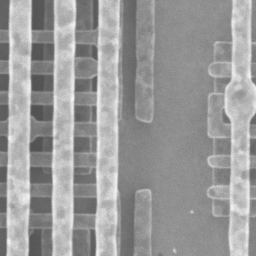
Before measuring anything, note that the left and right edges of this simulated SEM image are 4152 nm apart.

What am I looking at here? wiring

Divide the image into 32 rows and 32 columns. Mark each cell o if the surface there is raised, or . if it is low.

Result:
.ooo...oo...ooo..............oo.
.ooo...oo...ooo..............oo.
.ooo...oo...ooo..............oo.
.ooo...oo...ooo..............oo.
ooooooooooooooo..............oo.
.ooo..oooo.oooo..............oo.
.ooo...oo...ooo..............oo.
.ooo..ooooooooo..............oo.
ooooooooooooooo...........oooooo
.ooo..ooooooooo............ooooo
.ooo...oo...ooo..............ooo
oooooooooo..ooo.............oooo
ooooooooooooooo...........oooooo
.ooo...oo...ooo...........oooooo
.ooo...oo...ooo...........oooooo
ooooooooooooooo...........oooooo
ooooooooooooooo...........oooooo
.ooo...oo...ooo..............oo.
.ooo...oo...ooo..............oo.
ooooooooooooooo...........oooooo
ooooooooooooooo...........oooooo
.ooo...oo...ooo..............oo.
.ooo...oo...ooo..............oo.
ooooooooooooooo...........oooooo
ooooooooooooooo...........oooooo
.ooo...oo...ooo..............oo.
.ooo..ooo...ooo..............oo.
ooooooooooooooo..............oo.
oooo..ooooooooo..............oo.
.oo....oo...oo...............oo.
.ooo...oo...ooo..............oo.
.ooo...oo...ooo..............oo.